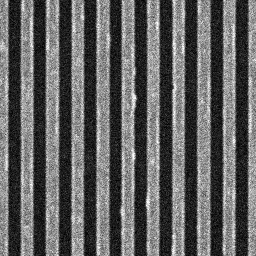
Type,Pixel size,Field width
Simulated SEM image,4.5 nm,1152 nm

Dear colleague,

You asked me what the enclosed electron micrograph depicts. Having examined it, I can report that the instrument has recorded parallel lines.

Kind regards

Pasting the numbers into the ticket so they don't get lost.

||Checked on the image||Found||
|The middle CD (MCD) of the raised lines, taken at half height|51.7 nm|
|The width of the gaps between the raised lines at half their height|60.1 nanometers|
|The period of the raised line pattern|114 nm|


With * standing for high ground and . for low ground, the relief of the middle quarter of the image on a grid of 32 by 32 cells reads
..***...***....***...***...***..
..***...***....***...***...***..
..***...***....***...***...***..
..***...***....***...***...***..
..***...***....***...***...***..
..***...***....***...***...***..
..***...***....***...**....***..
..***...***....***...**....***..
..***...***....***...**....***..
..***...***....***...**....***..
..***...***....***...**....***..
..***...***....***...**....***..
..***...***....**....**....***..
..***...***....**....**....***..
..***...***....**....**....***..
..***...***....**....**....***..
..***...***....**....**....***..
..***...***....**....**....***..
..***...***....**....**....***..
..***...***....**....**....***..
..***...***....**....***...***..
..***...***....**....***...***..
..***...***....***...**....***..
..***...***....***...**....***..
..***...***....**....***...***..
..***...***....**....***...***..
..***...***....**....**....***..
..***...***....**....**....***..
..***...***....**....**....***..
..***...***....**....**....***..
..***...***....**....**....***..
..***...***...***....**....***..